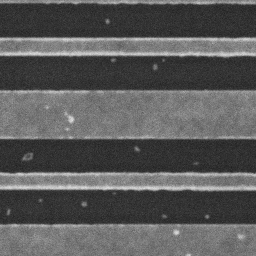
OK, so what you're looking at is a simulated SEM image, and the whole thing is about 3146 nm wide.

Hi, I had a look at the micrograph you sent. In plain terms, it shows lines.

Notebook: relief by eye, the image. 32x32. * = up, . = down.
................................
................................
................................
................................
................................
********************************
********************************
................................
................................
................................
................................
********************************
********************************
********************************
********************************
********************************
********************************
................................
................................
................................
................................
................................
********************************
********************************
................................
................................
................................
................................
********************************
********************************
********************************
********************************